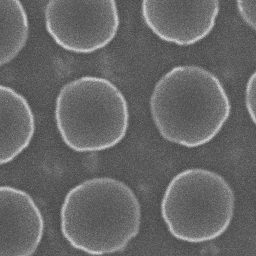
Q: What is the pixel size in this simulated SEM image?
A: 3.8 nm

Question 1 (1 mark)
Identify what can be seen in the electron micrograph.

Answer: raised bodies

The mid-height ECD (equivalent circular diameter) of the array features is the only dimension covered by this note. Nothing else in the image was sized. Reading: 280 nm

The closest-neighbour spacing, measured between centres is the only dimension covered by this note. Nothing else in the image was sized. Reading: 373 nm